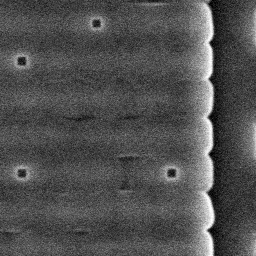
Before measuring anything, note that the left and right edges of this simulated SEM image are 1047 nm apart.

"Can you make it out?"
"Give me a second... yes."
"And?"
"wiring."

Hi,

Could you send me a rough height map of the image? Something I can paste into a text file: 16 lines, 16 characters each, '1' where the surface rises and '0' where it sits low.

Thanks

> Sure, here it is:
1111111111111000
1111111111111000
1111111111111000
1111111111111000
1111111111111000
1111111111111000
1111111111111000
1111111111111000
1111111111111000
1111111111111000
1111111111111000
1111111111111000
1111111111111000
1111111111111000
1111111111111000
1111111111111000